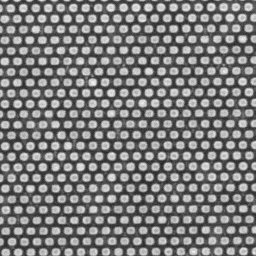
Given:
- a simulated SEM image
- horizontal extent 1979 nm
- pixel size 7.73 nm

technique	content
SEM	a regular array of raised bodies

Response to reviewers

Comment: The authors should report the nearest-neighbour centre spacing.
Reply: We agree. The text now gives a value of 92.6 nm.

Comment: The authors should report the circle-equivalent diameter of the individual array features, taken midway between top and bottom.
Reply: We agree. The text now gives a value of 59.8 nm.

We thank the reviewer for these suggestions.